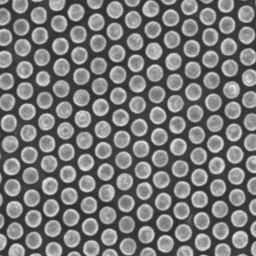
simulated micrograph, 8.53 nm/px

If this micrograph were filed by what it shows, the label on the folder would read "a regular array of raised bodies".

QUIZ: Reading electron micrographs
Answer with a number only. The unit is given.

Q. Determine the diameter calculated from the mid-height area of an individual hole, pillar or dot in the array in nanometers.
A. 136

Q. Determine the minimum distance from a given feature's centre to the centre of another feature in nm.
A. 178